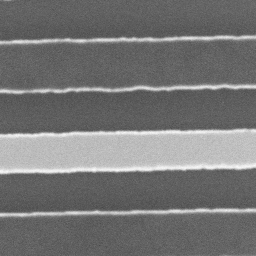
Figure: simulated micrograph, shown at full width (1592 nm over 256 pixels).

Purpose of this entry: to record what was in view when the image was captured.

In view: lines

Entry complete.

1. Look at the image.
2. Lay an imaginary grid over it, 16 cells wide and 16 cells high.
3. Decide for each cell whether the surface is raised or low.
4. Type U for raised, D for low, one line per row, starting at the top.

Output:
DDDDDDDDDDDDDDDD
DDDDDDDDDDDDDDDD
DDDDUDUUUUUUUUUU
UUUUUUUUUUUUUUUU
UUUUUUUUUUUUUUUU
UUUUUUUUUUUUUDDD
DDDDDDDDDDDDDDDD
DDDDDDDDDDDDDDDD
DDDDDDDDDDDDDDDD
DDDDDDDDDDDDDDDD
DDDDDDDDDDDDDDDD
DDDDDDDDDDDDDDDD
DDDDDDDDDDDDDDDD
UUUUUUUUUUUUUUUU
UUUUUUUUUUUUUUUU
UUUUUUUUUUUUUUUU